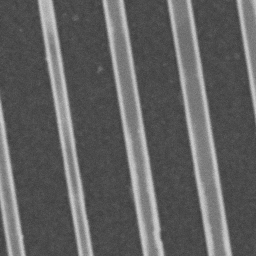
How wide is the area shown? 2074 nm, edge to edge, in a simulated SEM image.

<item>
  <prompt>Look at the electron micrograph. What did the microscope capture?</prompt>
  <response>one or a few lines or trenches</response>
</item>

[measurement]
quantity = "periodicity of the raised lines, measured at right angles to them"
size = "0.538 µm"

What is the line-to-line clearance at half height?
425 nm